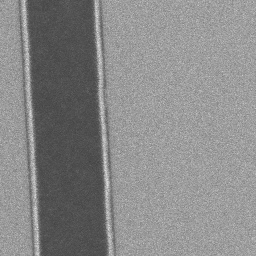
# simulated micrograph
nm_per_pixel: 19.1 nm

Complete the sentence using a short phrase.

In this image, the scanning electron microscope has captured one or a few lines or trenches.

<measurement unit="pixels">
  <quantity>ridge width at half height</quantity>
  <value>74.1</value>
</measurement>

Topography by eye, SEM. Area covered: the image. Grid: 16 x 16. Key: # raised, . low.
.#####..........
.#####..........
..####..........
..####..........
..####..........
..####..........
..####..........
..####..........
..#####.........
..#####.........
..#####.........
..#####.........
..#####.........
..#####.........
..#####.........
..#####.........